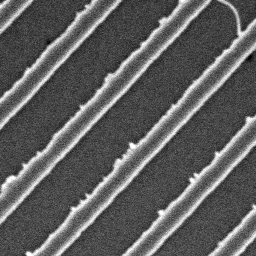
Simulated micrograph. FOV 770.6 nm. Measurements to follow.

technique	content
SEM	lines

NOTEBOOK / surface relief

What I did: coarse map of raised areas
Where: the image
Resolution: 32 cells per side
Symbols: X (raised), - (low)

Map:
XXXX-------XXXX-------XXXX------
XXX-------XXXX--------XXX-------
XX-------XXXX-------XXXX--------
X--------XXX--------XXX--------X
--------XXX--------XXX--------XX
------XXXX--------XXX--------XXX
------XXX--------XXX--------XXX-
-----XXX--------XXX--------XXX--
----XXX--------XXX--------XXXX--
---XXX--------XXX--------XXXX---
--XXX--------XXX--------XXXX----
-XXX--------XXXX-------XXXX-----
XXXX-------XXXX--------XXX------
XXX-------XXXX-------XXXX-------
X--------XXXX--------XXX--------
X-------XXXX--------XXX--------X
-------XXXX--------XXX--------XX
-------XXX--------XXX--------XXX
------XXX-------XXXX--------XXX-
----XXXX--------XXX--------XXXX-
---XXXX-------XXXX--------XXXX--
---XXX--------XXX--------XXXX---
-XXXX--------XXX--------XXXX----
XXXX--------XXX--------XXXX-----
XXX--------XXX---------XXX------
XX--------XXXX-------XXXX-------
X--------XXXX-------XXXX-------X
--------XXXX--------XXX-------XX
-------XXXX--------XXX--------XX
------XXXX--------XXX-------XXXX
-----XXXX--------XXX--------XXX-
----XXXX--------XXX--------XXX--